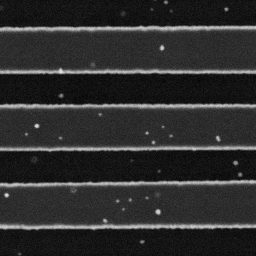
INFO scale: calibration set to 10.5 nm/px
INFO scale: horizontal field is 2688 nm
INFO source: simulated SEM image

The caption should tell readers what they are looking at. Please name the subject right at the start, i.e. lines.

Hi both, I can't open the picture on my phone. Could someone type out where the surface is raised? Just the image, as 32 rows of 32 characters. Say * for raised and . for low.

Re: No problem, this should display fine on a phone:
................................
................................
................................
....****************************
********************************
********************************
********************************
********************************
********************************
................................
................................
................................
................................
********************************
********************************
********************************
********************************
********************************
********************************
................................
................................
................................
................................
********************************
********************************
********************************
********************************
********************************
*************.****.......**.....
................................
................................
................................